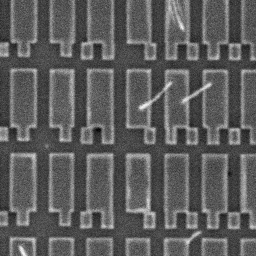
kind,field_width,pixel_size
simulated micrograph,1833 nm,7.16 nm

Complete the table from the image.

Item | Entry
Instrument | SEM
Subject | wiring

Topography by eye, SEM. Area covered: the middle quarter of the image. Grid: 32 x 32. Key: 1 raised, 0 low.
00000000000000000000000000000000
11000011111100001111110000000000
11000011111100001111110000111110
11000011111100001111110000111110
11000011111100001111110000111110
11000011111100001111110001111110
11000011111100001111110001111110
11000011111100001111110001111110
11000011111100001111110001111110
11000011111100001111110001111110
11000011111100001111110001111110
11000011111100001111110001111110
11000011111100001111110001111110
11000011111100001111100001111110
11000011111100001111100001111110
11000011111100001111100001111110
11000110001100000000111000110001
11000110001100000000111000110001
11001110001100000000111000110001
00000110001100000000111000110001
00000000000000000000000000000000
00000000000000000000000000000000
11000000111100000000000000000000
11000011111100001111100001111110
11000011111100001111100001111110
11000011111100001111100001111110
11000011111100001111100001111110
11000011111100001111100001111110
11000011111100001111100001111110
11000011111100001111100001111110
11000011111100001111100001111110
11000011111100001111100001111110